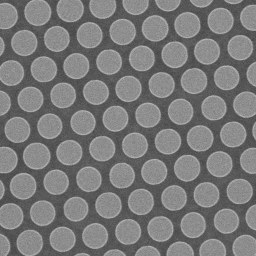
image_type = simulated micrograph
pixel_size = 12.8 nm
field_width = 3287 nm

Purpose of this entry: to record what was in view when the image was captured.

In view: an array of small figures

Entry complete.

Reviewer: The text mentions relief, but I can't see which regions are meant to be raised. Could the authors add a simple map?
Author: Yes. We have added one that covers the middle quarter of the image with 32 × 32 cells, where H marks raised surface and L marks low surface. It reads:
HHHHHHLLHHHHHHLLLHHHHHLLLLHHHLLL
HHHHHHLLLHHHHHLLLLHHHLLLLLLLLLLH
LHHHHHLLLLLHLLLLLLLLLLLHHHLLLLHH
LLHHLLLLLLLLLLHHHHLLLLHHHHHLLHHH
LLLLLLHHHLLLLLHHHHHLLHHHHHHHLHHH
HHLLLHHHHHHLLHHHHHHLLHHHHHHHLLHH
HHHLLHHHHHHLLHHHHHHLLHHHHHHLLLHH
HHHLLHHHHHHLLHHHHHHLLLHHHHHLLLLL
HHHLLHHHHHHLLLHHHHLLLLLLLLLLLLLL
HHLLLLHHHHLLLLLLLLLLLLLLLLLHHHHL
HHLLLLLLLLLLLLLLLLLHHHHLLLHHHHHH
LLLLLLLLLLLHHHHLLLHHHHHHLLHHHHHH
LLLHHHHLLLHHHHHHLLHHHHHHLLHHHHHH
LLHHHHHHLLHHHHHHLLHHHHHHLLHHHHHH
LLHHHHHHLLHHHHHHLLHHHHHHLLLHHHHL
LLHHHHHHLLHHHHHLLLLLHHHLLLLLLLLL
LLHHHHHLLLLHHHLLLLLLLLLLLHHLLLLL
LLLLHHLLLLLLLLLLHHHLLLLHHHHHHLLH
LLLLLLLLHHHLLLLHHHHHLLLHHHHHHLLH
HHHLLLLHHHHHLLLHHHHHHLLHHHHHHLLH
HHHHLLLHHHHHHLLHHHHHHLLHHHHHHLLH
HHHHLLHHHHHHHLLHHHHHHLLLHHHHLLLL
HHHHLLLHHHHHLLLHHHHHLLLLLLLLLLLL
HHHHLLLLHHHHLLLLLLLLLLLLLLLLLHHH
HHHLLLLLLLLLLLLLLLLLLHHHLLLLHHHH
LLLLLLLLLLLLHHHHHLLLHHHHHLLLHHHH
LLLLHHHHLLLLHHHHHLLHHHHHHHLLHHHH
LLLHHHHHHLLHHHHHHHLHHHHHHHLLHHHH
HLLHHHHHHLLLHHHHHHLLHHHHHLLLLHHH
HLLHHHHHHLLLHHHHHLLLLHHHLLLLLLLL
HLLLHHHHHLLLLHHHLLLLLLLLLLLHLLLL
LLLLLHHHLLLLLLLLLLHHLLLLLHHHHHLL